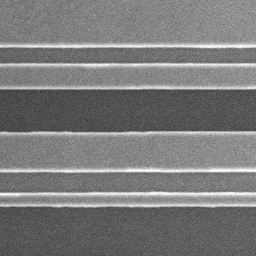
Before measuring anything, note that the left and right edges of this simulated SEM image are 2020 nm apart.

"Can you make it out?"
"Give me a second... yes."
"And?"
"lines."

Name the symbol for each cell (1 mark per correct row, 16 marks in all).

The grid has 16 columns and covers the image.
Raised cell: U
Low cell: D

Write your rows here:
UUUUUUUUUUUUUUUU
UUUUUUUUUUUUUUUU
UUUUUUUUUUUUUUUU
UUUUUUUUUUUUUUUU
UUUUUUUUUUUUUUUU
UUUUUUUUUDUUUUUU
DDDDDDDDDDDDDDDD
DDDDDDDDDDDDDDDD
UUUUUUUUUUUUUUUU
UUUUUUUUUUUUUUUU
UUUUUUUUUUUUUUUU
UUUUUUUUUUUUUUUU
UUUUUUUUUUUUUUUU
DDDDDDDDDDDDDDDD
DDDDDDDDDDDDDDDD
DDDDDDDDDDDDDDDD